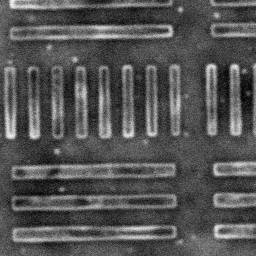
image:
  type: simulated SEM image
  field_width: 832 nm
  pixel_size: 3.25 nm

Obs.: groups of lines, slits or small figures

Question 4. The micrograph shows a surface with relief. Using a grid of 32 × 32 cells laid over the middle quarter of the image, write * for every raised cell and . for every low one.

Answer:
...........................*....
...**....**....**....**....**...
...**....**....**....**....**...
...**....**....**....**....**...
...**....**....**....**....**...
...**....**....**....**....**...
...**....**....**....**....**...
...**....**....**....**....**...
...**....**....**....**....**...
...**....**....**....**....**...
...**....**....**....**....**...
...**....**....**....**....**...
...**....**....**....**....**...
...***...**....**....**....**...
...***...**....**....**....**...
...***...**....**....**....**...
...***...**....**....**....**...
...***...**....**....**....*....
................................
................................
................................
................................
................................
................................
................................
........*******************.....
****************************....
***************************.....
................................
................................
................................
................................